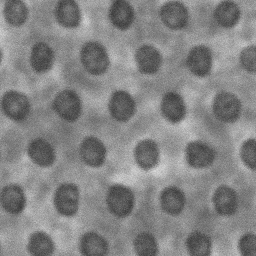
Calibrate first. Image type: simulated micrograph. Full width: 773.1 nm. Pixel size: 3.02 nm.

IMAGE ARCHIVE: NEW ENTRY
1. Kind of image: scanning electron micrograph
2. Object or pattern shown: a regular array of holes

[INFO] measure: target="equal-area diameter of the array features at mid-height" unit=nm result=92.3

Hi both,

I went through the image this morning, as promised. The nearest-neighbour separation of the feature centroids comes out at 0.158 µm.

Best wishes